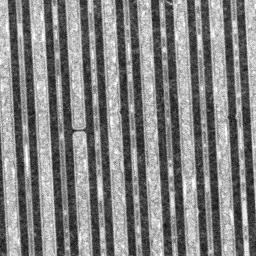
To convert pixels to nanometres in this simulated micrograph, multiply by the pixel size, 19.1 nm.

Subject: parallel lines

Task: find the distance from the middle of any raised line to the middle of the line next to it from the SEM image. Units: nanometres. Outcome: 336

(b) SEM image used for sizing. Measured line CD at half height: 196 nanometers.